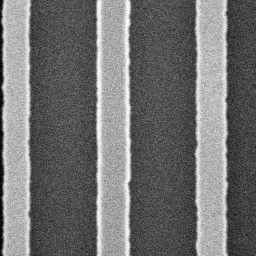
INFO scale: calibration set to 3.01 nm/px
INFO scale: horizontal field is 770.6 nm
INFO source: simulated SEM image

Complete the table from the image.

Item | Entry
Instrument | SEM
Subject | lines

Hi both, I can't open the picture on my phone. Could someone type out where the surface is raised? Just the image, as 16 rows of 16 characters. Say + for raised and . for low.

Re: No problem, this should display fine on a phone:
++....++....++..
++....++....++..
++....++....++..
++....++....++..
++....++....++..
++....++....++..
++....++....++..
++....++....++..
++....++....++..
++....++....++..
++....++....++..
++....++....++..
++....++....++..
++....++....++..
++....++....++..
++....++....++..